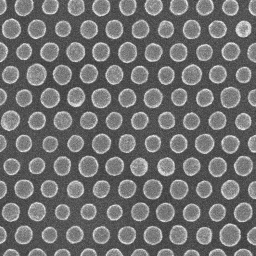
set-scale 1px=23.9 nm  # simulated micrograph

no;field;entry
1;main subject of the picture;a regular array of raised bodies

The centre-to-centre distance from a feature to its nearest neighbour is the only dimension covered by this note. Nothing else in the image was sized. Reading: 610 nm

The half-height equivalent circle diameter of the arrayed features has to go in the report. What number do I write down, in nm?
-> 432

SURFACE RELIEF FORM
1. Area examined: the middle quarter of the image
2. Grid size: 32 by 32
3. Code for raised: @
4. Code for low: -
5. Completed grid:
-----@@-----@@-----------------@
@@--@@@@---@@@---@@@@---@@@---@@
@@--@@@@---@@@@--@@@@---@@@@--@@
@@--@@@@---@@@@--@@@@---@@@@--@@
@----@@----@@@---@@@----@@@---@@
--------------------------------
--@@@---@@@----@@----@@@----@@--
-@@@@--@@@@---@@@@--@@@@---@@@@-
-@@@@--@@@@@--@@@@--@@@@@--@@@@-
-@@@@--@@@@@--@@@@--@@@@---@@@--
--@@----@@@----@-----@@@--------
--------------------------------
@----@@@---@@@----@@----@@@----@
@@--@@@@---@@@@--@@@@---@@@@--@@
@@--@@@@---@@@@--@@@@---@@@@--@@
@---@@@@---@@@---@@@@---@@@---@@
--------------------------------
---------@----------------------
--@@----@@@---@@@----@@@---@@@--
-@@@@--@@@@@--@@@@--@@@@---@@@@-
-@@@@--@@@@@--@@@@---@@@---@@@@-
--@@----@@@---@@@----@@----@@@--
--------------------------------
@----@@@----@@----@-------------
@@--@@@@---@@@@--@@@@---@@@---@@
@---@@@@--@@@@@--@@@@--@@@@---@@
@---@@@@--@@@@@--@@@@---@@@---@@
@---@@@@---@@@---@@@----@@@----@
--------------------------------
--@@----@@@---@@@----@@@---@@@--
-@@@@---@@@---@@@@--@@@@@--@@@@-
-@@@@--@@@@---@@@@--@@@@@--@@@@-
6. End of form